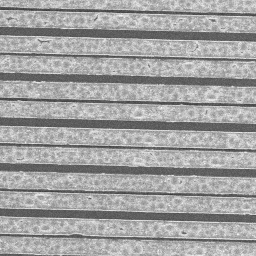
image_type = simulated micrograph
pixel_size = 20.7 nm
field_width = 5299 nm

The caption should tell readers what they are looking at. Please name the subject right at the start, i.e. parallel lines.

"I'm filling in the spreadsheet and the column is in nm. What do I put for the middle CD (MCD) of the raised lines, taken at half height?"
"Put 342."